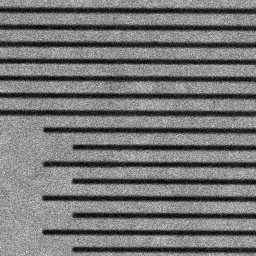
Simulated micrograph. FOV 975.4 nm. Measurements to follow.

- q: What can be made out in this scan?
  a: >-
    parallel lines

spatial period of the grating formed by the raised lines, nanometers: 65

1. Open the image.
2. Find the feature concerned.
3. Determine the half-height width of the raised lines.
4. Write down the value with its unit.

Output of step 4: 44.8 nm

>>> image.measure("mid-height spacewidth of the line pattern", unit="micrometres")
0.0205